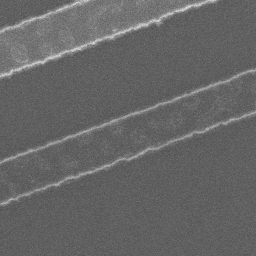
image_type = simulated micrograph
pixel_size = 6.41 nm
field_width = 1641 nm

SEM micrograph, one or a few lines or trenches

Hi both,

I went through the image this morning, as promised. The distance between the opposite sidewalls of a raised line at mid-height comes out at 259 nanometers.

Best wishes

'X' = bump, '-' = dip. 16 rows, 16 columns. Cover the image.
----XXXXXXXX----
-XXXXXXXX-------
XXXXXX----------
XXXX------------
X--------------X
-------------XXX
----------XXXXXX
-------XXXXXXXX-
----XXXXXXXX----
--XXXXXXX-------
XXXXXX----------
XXXX------------
X---------------
----------------
----------------
----------------